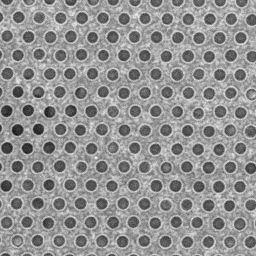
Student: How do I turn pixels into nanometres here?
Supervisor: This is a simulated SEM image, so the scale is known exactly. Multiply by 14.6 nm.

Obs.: a regular array of holes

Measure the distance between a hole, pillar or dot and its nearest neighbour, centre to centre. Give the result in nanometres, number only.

300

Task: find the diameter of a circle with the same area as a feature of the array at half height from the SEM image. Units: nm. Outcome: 182